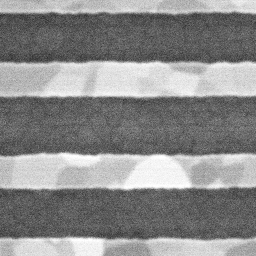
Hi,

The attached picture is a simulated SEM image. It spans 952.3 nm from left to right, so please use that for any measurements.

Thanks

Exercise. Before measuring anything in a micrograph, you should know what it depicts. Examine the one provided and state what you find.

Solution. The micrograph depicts lines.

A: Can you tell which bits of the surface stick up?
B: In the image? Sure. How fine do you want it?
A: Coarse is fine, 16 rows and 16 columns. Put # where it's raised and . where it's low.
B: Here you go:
################
................
................
................
################
################
................
................
................
................
################
################
................
................
................
################